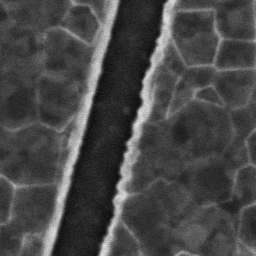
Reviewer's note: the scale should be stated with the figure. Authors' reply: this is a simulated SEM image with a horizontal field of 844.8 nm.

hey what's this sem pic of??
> one or a few lines or trenches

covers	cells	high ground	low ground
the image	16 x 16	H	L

HHHHHHHLLLLHHHHH
HHHHHHHLLLHHHHHH
HHHHHHHLLLHHHHHH
HHHHHHLLLLHHHHHH
HHHHHHLLLHHHHHHH
HHHHHHLLLHHHHHHH
HHHHHLLLLHHHHHHH
HHHHHLLLLHHHHHHH
HHHHHLLLHHHHHHHH
HHHHHLLLHHHHHHHH
HHHHLLLLHHHHHHHH
HHHHLLLLHHHHHHHH
HHHHLLLHHHHHHHHH
HHHHLLLHHHHHHHHH
HHHLLLLHHHHHHHHH
HHHLLLLHHHHHHHHH